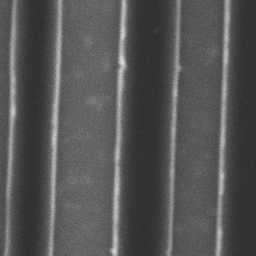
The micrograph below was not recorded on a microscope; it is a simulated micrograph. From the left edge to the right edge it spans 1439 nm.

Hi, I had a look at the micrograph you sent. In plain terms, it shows one or a few lines or trenches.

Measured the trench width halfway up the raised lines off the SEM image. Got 53.8 pixels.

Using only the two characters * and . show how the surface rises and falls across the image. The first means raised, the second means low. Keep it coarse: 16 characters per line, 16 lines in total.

.***....***...**
.***....***...**
.***....***...**
.***....***...**
.***...****...**
.***...****...**
.***...****...**
.**....****...**
.**....****...**
.**....****...**
.**....****...**
.**....****...**
***....****...**
***....****...**
***....****...**
***....****...**